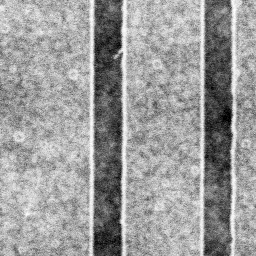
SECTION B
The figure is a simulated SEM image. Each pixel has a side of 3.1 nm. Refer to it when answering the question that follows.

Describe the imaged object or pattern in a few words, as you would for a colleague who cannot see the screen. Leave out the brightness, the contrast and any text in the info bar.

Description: one or a few lines or trenches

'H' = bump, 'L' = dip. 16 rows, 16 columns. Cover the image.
HHHHHHLLHHHHHLLH
HHHHHHLLHHHHHLLH
HHHHHHLLHHHHHLLH
HHHHHHLLHHHHHLLH
HHHHHHLLHHHHHLLH
HHHHHHLLHHHHHLLH
HHHHHHLLHHHHHLLH
HHHHHHLLHHHHHLLH
HHHHHHLLHHHHHLLH
HHHHHHLLHHHHHLLH
HHHHHHLLHHHHHLLH
HHHHHHLLHHHHHLLH
HHHHHHLLHHHHHLLH
HHHHHHLLHHHHHLLH
HHHHHHLLHHHHHLLH
HHHHHHLLHHHHHLLH